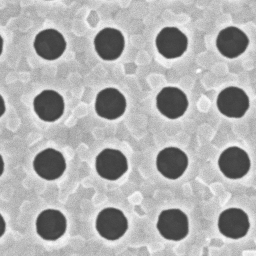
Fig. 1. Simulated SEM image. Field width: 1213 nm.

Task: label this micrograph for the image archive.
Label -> a regular array of holes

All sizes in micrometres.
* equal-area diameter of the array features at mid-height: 0.15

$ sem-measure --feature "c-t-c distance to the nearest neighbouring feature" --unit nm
284